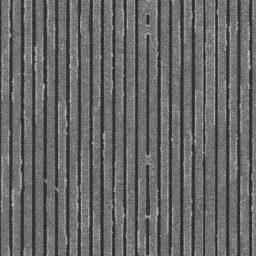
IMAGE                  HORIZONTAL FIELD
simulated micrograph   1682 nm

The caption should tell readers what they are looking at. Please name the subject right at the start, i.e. parallel lines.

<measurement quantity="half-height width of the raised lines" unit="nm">53.4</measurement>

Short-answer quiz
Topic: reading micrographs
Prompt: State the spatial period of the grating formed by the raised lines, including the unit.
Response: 75 nanometres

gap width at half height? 0.0238 microns